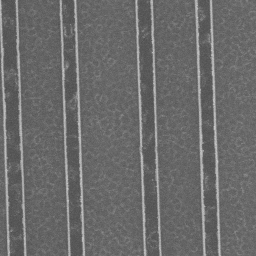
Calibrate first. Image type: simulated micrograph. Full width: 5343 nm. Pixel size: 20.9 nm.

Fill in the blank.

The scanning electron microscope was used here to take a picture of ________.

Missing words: one or a few lines or trenches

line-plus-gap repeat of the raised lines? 1360 nm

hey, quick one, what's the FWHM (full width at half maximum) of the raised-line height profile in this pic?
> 0.318 µm